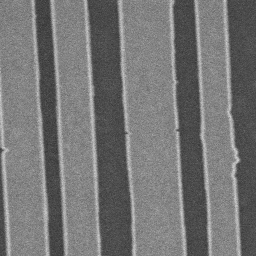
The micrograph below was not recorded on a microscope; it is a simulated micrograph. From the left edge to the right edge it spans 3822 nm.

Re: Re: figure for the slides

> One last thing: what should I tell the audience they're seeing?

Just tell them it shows one or a few lines or trenches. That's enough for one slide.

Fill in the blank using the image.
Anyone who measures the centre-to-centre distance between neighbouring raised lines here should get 1010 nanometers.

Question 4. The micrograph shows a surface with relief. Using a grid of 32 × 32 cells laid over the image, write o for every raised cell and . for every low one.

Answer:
oooo...oooo....oooooo....ooo....
oooo...oooo....oooooo....ooo....
oooo...oooo....oooooo....ooo....
oooo...oooo....oooooo....ooo....
oooo...oooo....oooooo....ooo....
oooo...oooo....ooooooo...ooo....
oooo...oooo....ooooooo...ooo....
oooo...oooo....ooooooo...ooo....
ooooo..oooo....ooooooo...ooo....
ooooo..oooo....ooooooo...ooo....
ooooo..oooo.....oooooo...ooo....
ooooo..oooo.....oooooo...oooo...
ooooo..oooo.....oooooo...oooo...
ooooo..oooo.....oooooo...oooo...
ooooo..oooo.....oooooo...oooo...
ooooo..ooooo....oooooo...oooo...
ooooo...oooo....oooooo...oooo...
ooooo...oooo....oooooo...oooo...
.oooo...oooo....oooooo....ooo...
ooooo...oooo....oooooo....oooo..
.oooo...oooo....oooooo....ooo...
.oooo...oooo....oooooo....ooo...
.oooo...oooo....oooooo....ooo...
.ooooo..oooo....oooooo....ooo...
.ooooo..oooo.....ooooo....ooo...
.ooooo..oooo.....oooooo...ooo...
.ooooo..oooo.....oooooo...ooo...
.ooooo..oooo.....oooooo...oooo..
.ooooo..oooo.....oooooo...oooo..
.ooooo..oooo.....oooooo...oooo..
.ooooo..oooo.....oooooo...oooo..
.ooooo..oooo.....oooooo...oooo..